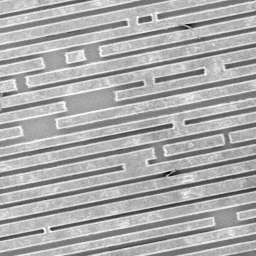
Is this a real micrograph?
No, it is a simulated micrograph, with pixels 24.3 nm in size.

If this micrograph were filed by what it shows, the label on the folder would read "parallel lines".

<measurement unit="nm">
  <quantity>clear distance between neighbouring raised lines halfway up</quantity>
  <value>143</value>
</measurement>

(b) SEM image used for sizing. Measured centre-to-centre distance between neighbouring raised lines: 15.6 pixels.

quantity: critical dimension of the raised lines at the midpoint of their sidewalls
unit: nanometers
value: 250